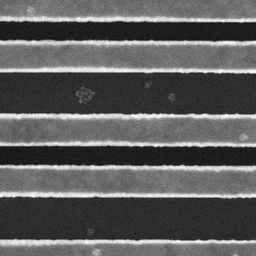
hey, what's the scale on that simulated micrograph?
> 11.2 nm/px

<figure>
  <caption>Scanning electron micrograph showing lines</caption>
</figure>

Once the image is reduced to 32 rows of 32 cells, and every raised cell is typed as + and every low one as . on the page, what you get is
++++++++++++++++++++++++++++++++
++++++++++++++++++++++++++++++++
++++++++++++++++++++++++++++++++
................................
................................
++++++++++++++++++++++++++++++++
++++++++++++++++++++++++++++++++
++++++++++++++++++++++++++++++++
++++++++++++++++++++++++++++++++
................................
................................
................................
................................
................................
++++++++++++++++++++++++++++++++
++++++++++++++++++++++++++++++++
++++++++++++++++++++++++++++++++
++++++++++++++++++++++++++++++++
................................
................................
................................
++++++++++++++++++++++++++++++++
++++++++++++++++++++++++++++++++
++++++++++++++++++++++++++++++++
+...++++++++++++++++++++++++++++
................................
................................
................................
................................
................................
++++++++++++++++++++++++++++++++
++++++++++++++++++++++++++++++++